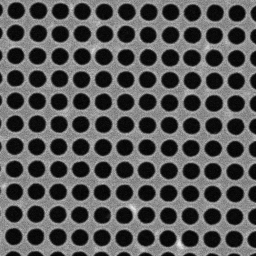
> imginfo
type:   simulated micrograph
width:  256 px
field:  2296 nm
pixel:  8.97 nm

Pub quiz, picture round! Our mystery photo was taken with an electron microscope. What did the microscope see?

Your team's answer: a regular array of holes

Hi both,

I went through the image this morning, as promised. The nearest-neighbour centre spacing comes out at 196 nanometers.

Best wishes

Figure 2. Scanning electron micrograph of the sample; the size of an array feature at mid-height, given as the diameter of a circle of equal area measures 0.155 microns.